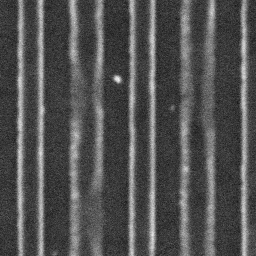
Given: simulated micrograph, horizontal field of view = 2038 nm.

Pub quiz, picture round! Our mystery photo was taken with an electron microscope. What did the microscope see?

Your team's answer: lines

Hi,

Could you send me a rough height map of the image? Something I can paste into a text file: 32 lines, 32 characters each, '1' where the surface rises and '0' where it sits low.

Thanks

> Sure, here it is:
00111000011110001110000111100011
00111000011110001110000111100011
00111000011110001110000111100011
00111000011110001110000111000011
00111000011110001110000111000011
00111000011110001110000111000011
00111000011110001110000111000011
00111000011110001110000111000011
00111000011110001110000111000011
00111000011100001110000111000011
00111000001100001110000111000011
00111000001100001110000111000011
00111000001100001110000111000011
00111000001110001110000111000011
00111000011110001110000111000011
00111000011110001110000111000011
00111000011110001110000111000011
00111000011110001110000111000011
00111000011110001110000111000011
00111000011110001110000111000011
00111000011110001110000111000011
00111000011110001110000111000011
00111000011100001110000111000011
00111000011100001110000111000011
00111000011100001110000111000011
00111000011100001110000111000011
00111000011100001110000111000011
00111000011100001110000111000011
00111000011100001110000111000011
00111000011100001110000111000011
00111000011100001110000111000011
00111000011100001110000111000011